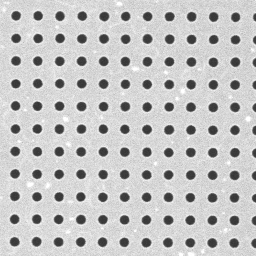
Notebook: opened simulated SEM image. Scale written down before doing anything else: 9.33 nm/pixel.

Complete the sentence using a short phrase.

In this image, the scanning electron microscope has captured a regular array of holes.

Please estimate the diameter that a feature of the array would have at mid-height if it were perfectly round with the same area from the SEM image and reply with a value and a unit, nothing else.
88.1 nm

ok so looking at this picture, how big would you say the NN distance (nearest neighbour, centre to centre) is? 204 nm